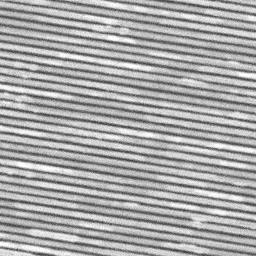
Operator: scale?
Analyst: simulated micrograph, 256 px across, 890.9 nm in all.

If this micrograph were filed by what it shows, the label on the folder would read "parallel lines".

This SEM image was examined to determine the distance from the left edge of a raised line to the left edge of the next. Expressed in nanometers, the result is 28.5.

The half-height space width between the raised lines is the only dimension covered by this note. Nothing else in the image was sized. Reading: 13.3 nanometres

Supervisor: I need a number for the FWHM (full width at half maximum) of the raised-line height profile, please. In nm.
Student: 16.8